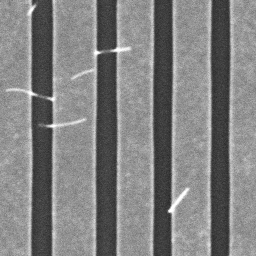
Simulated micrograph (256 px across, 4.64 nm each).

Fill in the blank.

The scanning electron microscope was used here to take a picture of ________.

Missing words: groups of lines, slits or small figures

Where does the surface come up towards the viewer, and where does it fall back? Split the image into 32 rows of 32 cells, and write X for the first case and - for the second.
XXXX---XXXXX---XXXX---XXXX---XXX
XXXX---XXXXX---XXXX---XXXX---XXX
XXXX---XXXXX---XXXX---XXXX---XXX
XXXX---XXXXX---XXXX---XXXX---XXX
XXXX---XXXXX---XXXX---XXXX---XXX
XXXX---XXXXX---XXXX---XXXX---XXX
XXXX---XXXXX---XXXX---XXXX---XXX
XXXX---XXXXX---XXXX---XXXX---XXX
XXXX---XXXXX---XXXX---XXXX---XXX
XXXX---XXXXX---XXXX---XXXX---XXX
XXXX---XXXXX---XXXX---XXXX---XXX
XXXX---XXXXX---XXXX---XXXX---XXX
XXXX---XXXXX---XXXX---XXXX---XXX
XXXX---XXXXX---XXXX---XXXX---XXX
XXXX---XXXXX---XXXX---XXXX---XXX
XXXX---XXXXX---XXXX---XXXX---XXX
XXXX---XXXXX---XXXX---XXXX---XXX
XXXX---XXXXX---XXXX---XXXX---XXX
XXXX---XXXXX---XXXX---XXXX---XXX
XXXX---XXXXX---XXXX---XXXX---XXX
XXXX---XXXXX---XXXX---XXXX---XXX
XXXX---XXXXX---XXXX---XXXX---XXX
XXXX---XXXXX---XXXX---XXXX---XXX
XXXX---XXXXX---XXXX--XXXXX---XXX
XXXX---XXXXX---XXXX--XXXXX---XXX
XXXX---XXXXX---XXXX--XXXXX---XXX
XXXX---XXXXX---XXXX--XXXXX---XXX
XXXX---XXXXX---XXXX--XXXXX---XXX
XXXX---XXXXX---XXXX--XXXXX---XXX
XXXX---XXXXX---XXXX--XXXXX---XXX
XXXX---XXXXX---XXXX--XXXXX---XXX
XXXX---XXXXX---XXXX---XXXX---XXX